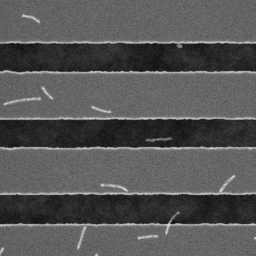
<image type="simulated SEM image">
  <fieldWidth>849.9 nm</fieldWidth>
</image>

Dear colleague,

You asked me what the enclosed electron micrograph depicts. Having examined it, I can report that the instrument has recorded lines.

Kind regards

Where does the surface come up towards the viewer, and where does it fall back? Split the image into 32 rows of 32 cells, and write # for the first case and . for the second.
################################
################################
################################
################################
################################
................................
................................
................................
................................
################################
################################
################################
################################
################################
################################
................................
................................
................................
########.#######################
################################
################################
################################
################################
################################
................................
................................
................................
................................
################################
################################
################################
################################